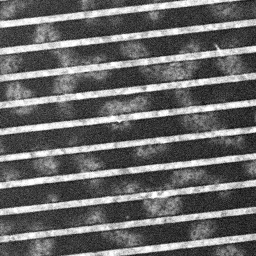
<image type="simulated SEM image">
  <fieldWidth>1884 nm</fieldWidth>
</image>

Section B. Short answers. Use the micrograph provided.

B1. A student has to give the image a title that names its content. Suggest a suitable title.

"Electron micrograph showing parallel lines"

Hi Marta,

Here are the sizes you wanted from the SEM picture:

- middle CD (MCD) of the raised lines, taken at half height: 35.6 nanometers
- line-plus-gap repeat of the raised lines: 196 nanometers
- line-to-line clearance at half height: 161 nm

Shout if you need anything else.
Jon